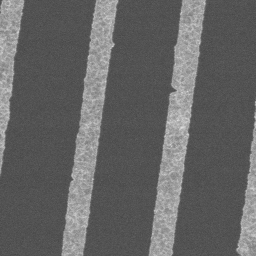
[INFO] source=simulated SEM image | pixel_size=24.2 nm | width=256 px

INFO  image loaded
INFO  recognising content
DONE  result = one or a few lines or trenches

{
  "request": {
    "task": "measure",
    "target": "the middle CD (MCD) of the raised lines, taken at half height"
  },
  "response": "18 px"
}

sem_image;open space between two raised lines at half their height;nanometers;1600